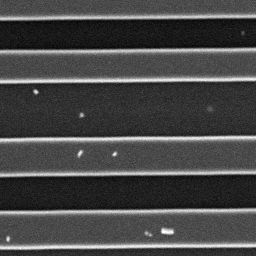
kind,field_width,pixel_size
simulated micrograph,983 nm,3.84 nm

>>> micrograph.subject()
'groups of lines, slits or small figures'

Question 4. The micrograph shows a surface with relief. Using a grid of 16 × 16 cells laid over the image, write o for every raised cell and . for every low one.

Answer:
oooooooooooooooo
................
................
oooooooooooooooo
oooooooooooooooo
................
................
................
................
oooooooooooooooo
oooooooooooooooo
................
................
oooooooooooooooo
oooooooooooooooo
................